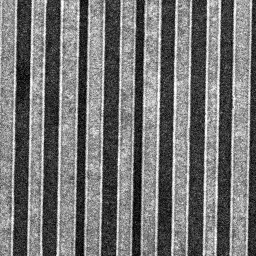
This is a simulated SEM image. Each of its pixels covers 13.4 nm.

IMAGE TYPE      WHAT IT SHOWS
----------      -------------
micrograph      parallel lines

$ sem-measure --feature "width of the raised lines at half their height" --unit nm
189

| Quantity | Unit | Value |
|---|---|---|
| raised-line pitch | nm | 390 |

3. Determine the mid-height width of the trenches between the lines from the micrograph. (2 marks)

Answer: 213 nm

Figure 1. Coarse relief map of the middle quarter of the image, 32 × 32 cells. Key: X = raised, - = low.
XXX---XXXX----XXX---XXXX----XXX-
XXX---XXXX----XXX---XXXX----XXX-
XXX---XXXX----XXX---XXXX----XXX-
XXX---XXXX----XXX---XXXX----XXX-
XXX---XXXX----XXX---XXXX----XXX-
XXX---XXXX----XXX---XXXX----XXX-
XXX---XXXX----XXX---XXXX----XXX-
XXX---XXXX----XXX---XXXX----XXX-
XXX---XXXX----XXX---XXXX----XXX-
XXX---XXXX----XXX---XXXX----XXX-
XXX---XXXX----XXX---XXX-----XXX-
XXX---XXXX----XXX---XXX-----XXX-
XXX---XXXX----XXX---XXX-----XXX-
XXX---XXXX----XXX---XXX-----XXX-
XXX---XXXX----XXX---XXX-----XXX-
XXX---XXXX----XXX---XXX-----XXX-
XXX---XXX-----XXX---XXX-----XXX-
XXX---XXX-----XXX---XXX-----XXX-
XXX---XXX-----XXX---XXX-----XXX-
XXX---XXX-----XXX---XXX-----XXX-
XXX---XXX-----XXX---XXX-----XXX-
XXX---XXX-----XXX---XXX-----XXX-
XXX---XXX-----XXX---XXX-----XXX-
XXX---XXX-----XXX---XXX-----XXX-
XXX---XXX-----XXX---XXX-----XXX-
XXX---XXX-----XXX---XXX-----XXX-
XXX---XXX-----XXX---XXX----XXXX-
XXX---XXX-----XXX---XXX----XXXX-
XXX---XXX-----XXX---XXX-----XXX-
XXX---XXX-----XXX---XXX-----XXX-
XXX---XXX-----XXX---XXX-----XXX-
XXX---XXX-----XXX---XXX-----XXX-